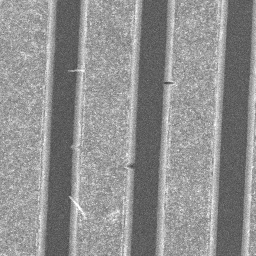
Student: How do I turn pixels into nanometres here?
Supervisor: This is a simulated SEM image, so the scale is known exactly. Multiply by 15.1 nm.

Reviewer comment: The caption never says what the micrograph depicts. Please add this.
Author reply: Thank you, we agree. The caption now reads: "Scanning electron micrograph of one or a few lines or trenches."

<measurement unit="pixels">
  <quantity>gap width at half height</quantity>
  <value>30.2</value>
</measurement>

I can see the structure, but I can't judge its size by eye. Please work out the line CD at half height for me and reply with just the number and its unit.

837 nm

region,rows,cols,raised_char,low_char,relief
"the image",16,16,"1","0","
1110011110011100
1110011110011100
1110011110011100
1110011110011100
1110011100111100
1110011100111100
1110011100111100
1110011100111100
1110011100111100
1110011100111100
1110011100111100
1110011100111001
1110011100111001
1110011100111001
1110011100111001
1110111100111001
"